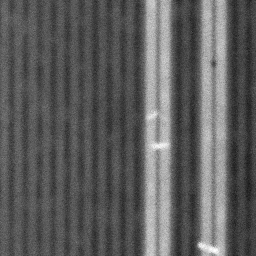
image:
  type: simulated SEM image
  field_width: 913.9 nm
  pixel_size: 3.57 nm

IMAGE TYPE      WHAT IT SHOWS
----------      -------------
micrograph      parallel lines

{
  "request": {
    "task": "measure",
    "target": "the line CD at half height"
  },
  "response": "31.7 nm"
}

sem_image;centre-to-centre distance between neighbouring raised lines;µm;0.0497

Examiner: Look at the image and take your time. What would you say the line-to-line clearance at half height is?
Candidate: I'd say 0.0178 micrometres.